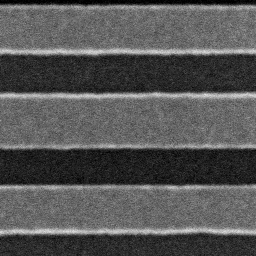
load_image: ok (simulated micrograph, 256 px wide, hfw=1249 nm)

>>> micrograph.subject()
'lines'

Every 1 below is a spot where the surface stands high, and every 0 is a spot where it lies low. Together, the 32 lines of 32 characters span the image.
00000000000000000000000000000000
11111111111111111111111111111111
11111111111111111111111111111111
11111111111111111111111111111111
11111111111111111111111111111111
11111111111111111111111111111111
00001100000110000001111011110000
00000000000000000000000000000000
00000000000000000000000000000000
00000000000000000000000000000000
00000000000000000000000000000000
00000000000000000000000000000000
11111111111111111111111111111111
11111111111111111111111111111111
11111111111111111111111111111111
11111111111111111111111111111111
11111111111111111111111111111111
11111111111111111111111111111111
10000001100000000000000000000000
00000000000000000000000000000000
00000000000000000000000000000000
00000000000000000000000000000000
00000000000000000000000000000000
11111111111111111111111111111111
11111111111111111111111111111111
11111111111111111111111111111111
11111111111111111111111111111111
11111111111111111111111111111111
11111111111111111111111111111111
00000000000000000000000000000000
00000000000000000000000000000000
00000000000000000000000000000000